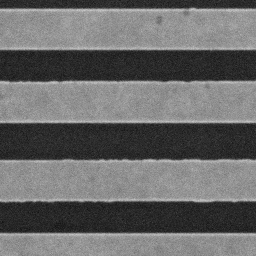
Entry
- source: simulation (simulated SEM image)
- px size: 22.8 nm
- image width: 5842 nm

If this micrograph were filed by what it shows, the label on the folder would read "lines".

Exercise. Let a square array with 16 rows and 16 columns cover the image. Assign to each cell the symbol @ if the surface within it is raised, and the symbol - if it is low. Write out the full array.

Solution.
----------------
@@@@@@@@@@@@@@@@
@@@@@@@@@@@@@@@@
----------------
----------------
@@@@@@@@@@@@@@@@
@@@@@@@@@@@@@@@@
@@@@@@@@@@@@@@@@
----------------
----------------
@@@@@@@@@@@@@@@@
@@@@@@@@@@@@@@@@
@@@@@@@@@@@@@@@@
----------------
----------------
@@@@@@@@@@@@@@@@